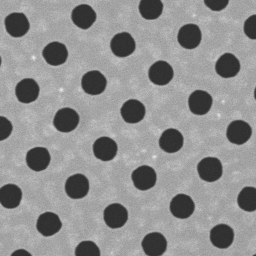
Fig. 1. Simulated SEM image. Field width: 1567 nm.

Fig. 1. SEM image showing a regular array of holes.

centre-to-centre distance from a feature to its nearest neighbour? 286 nanometers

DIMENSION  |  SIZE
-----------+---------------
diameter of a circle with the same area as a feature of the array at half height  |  150 nm